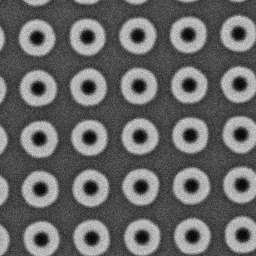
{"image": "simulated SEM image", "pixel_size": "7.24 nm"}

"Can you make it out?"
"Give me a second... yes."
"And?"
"an array of small figures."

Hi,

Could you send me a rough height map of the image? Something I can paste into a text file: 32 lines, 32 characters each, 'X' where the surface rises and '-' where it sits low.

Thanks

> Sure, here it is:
----X---------------------------
--------------------------------
----------XX----XX----XXX---XXX-
---XXX---XXXX--XXXX--XXXXX--XXXX
--XXXXX--XXXX--XXXX--XXXXX--XXXX
---XXXX--XXXX--XXXX---XXX---XXXX
---XXX----XX----XX-----X--------
--------------------------------
-----------------------X-----XX-
---XXX---XXXX---XXX---XXXX--XXXX
X--XXXX--XXXX--XXXXX-XXXXX--XXXX
X--XXXX--XXXX--XXXXX--XXXX--XXXX
---XXXX--XXXX---XXX---XXX----XX-
--------------------------------
--------------------------------
----XX----XXX---XXX---XXXX--XXXX
X--XXXX--XXXX--XXXXX--XXXX--XXXX
X--XXXX--XXXX--XXXXX--XXXX--XXXX
X--XXXX--XXXX---XXX---XXX----XXX
----XX--------------------------
--------------------------------
----XX----XX----XXX----XX----XXX
X--XXXX--XXXX---XXXX--XXXX--XXXX
X--XXXX--XXXXX-XXXXX--XXXX--XXXX
X--XXXX--XXXX---XXXX--XXXX--XXXX
----XX----XX-----X--------------
--------------------------------
-----------------X-----XX----XX-
---XXXX---XXX---XXXX--XXXX--XXXX
X--XXXX--XXXXX--XXXX--XXXX--XXXX
X--XXXX--XXXXX--XXXX--XXXX--XXXX
X---XXX---XXX---XXX----XX-----X-